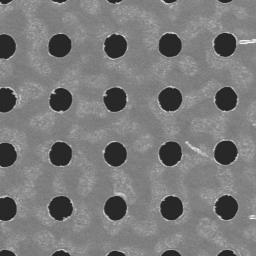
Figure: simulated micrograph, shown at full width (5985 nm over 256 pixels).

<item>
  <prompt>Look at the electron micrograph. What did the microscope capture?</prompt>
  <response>a regular array of holes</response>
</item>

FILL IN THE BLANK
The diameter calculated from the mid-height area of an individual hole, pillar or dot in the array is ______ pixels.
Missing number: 23.7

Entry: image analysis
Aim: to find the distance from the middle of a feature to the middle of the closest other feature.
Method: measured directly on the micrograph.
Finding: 1260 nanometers